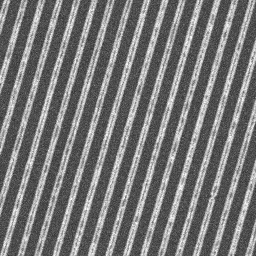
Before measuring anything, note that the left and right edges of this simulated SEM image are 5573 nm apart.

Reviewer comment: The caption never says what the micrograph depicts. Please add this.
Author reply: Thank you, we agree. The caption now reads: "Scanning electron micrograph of parallel lines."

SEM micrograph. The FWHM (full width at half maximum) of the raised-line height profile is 94.2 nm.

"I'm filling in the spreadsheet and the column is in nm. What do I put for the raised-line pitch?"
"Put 367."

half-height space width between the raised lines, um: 0.267